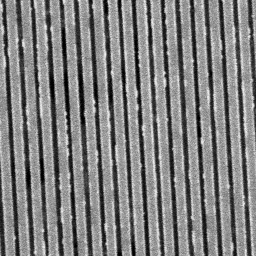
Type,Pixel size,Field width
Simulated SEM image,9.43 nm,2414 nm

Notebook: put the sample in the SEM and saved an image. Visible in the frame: parallel lines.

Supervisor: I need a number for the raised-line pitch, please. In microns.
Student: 0.136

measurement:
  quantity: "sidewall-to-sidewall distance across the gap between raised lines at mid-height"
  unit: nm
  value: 44.7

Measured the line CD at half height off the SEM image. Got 0.0883 microns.